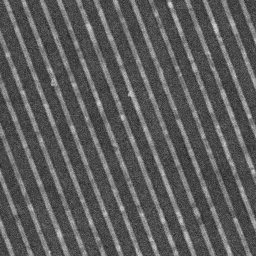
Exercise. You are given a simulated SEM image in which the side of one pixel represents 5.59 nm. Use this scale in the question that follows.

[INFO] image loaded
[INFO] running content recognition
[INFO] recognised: parallel lines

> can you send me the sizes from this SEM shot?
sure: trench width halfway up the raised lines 73.7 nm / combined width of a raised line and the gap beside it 94.8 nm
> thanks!